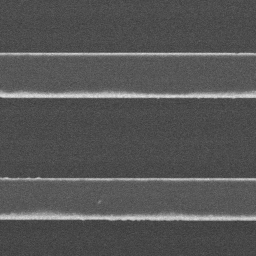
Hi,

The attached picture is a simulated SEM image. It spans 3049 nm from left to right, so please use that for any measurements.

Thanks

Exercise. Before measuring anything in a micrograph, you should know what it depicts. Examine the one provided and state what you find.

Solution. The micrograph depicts lines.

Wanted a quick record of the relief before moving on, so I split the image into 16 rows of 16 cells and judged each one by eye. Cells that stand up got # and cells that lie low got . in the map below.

................
................
................
################
################
################
................
................
................
................
................
################
################
################
................
................